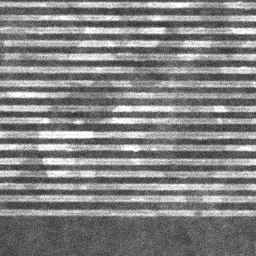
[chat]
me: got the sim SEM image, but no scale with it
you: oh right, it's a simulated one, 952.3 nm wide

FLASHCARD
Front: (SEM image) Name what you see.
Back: parallel lines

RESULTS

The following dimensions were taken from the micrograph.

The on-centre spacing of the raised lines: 48.3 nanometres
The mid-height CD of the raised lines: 17.7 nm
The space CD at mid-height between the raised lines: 0.0289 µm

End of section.